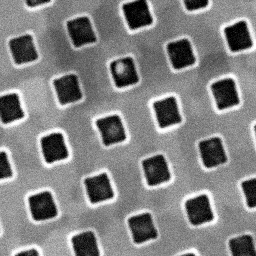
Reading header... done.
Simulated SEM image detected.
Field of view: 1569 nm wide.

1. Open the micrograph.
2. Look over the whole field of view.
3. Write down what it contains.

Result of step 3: a regular array of holes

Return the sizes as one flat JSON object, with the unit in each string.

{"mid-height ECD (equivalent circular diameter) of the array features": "187 nm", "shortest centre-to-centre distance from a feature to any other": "361 nm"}